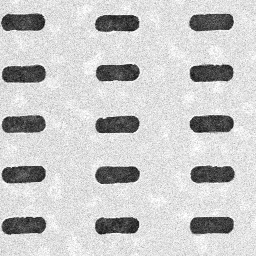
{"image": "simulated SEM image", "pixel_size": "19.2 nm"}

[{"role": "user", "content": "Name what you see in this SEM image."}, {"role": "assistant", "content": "a regular array of holes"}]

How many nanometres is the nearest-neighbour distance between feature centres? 973